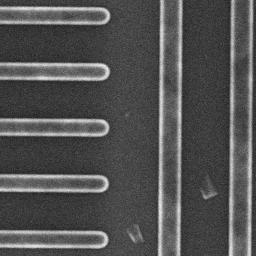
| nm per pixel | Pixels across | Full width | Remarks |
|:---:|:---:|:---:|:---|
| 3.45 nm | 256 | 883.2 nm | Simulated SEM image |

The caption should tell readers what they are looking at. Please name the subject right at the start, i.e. groups of lines, slits or small figures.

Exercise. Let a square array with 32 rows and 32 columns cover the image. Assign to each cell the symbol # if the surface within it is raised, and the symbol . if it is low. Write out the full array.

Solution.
....................###......###
#############.......###......##.
#############.......###......##.
....................###......##.
....................###......##.
....................###......##.
....................###......##.
....................###......##.
#############.......###......##.
#############.......###......##.
....................###......##.
....................###......##.
....................###......##.
....................###......##.
....................###......##.
#############.......##.......##.
#############.......##.......##.
....................##.......##.
....................##.......##.
....................##.......##.
....................##.......##.
....................##.......##.
#############.......##.......##.
#############.......##.......##.
....................##.......##.
....................##.......##.
....................##.......##.
....................##.......##.
....................##.......##.
#############.......##.......##.
#############.......##.......##.
....................##.......##.